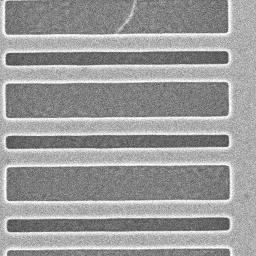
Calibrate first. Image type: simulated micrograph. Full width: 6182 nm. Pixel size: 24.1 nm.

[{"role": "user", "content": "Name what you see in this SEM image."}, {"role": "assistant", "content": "groups of lines, slits or small figures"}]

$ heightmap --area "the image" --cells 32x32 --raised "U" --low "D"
UDDDDDDDDDDDDDDDDDDDDDDDDDDDDUUU
UDDDDDDDDDDDDDDDDDDDDDDDDDDDDUUU
UDDDDDDDDDDDDDDDDDDDDDDDDDDDDUUU
UDDDDDDDDDDDDDDDDDDDDDDDDDDDDUUU
UUUUUUUUUUUUUUUUUUUUUUUUUUUUUUUU
UUUUUUUUUUUUUUUUUUUUUUUUUUUUUUUU
UUUUUDDDDDDDDDDDDDDDDDDDDDDDUUUU
UDDDDDDDDDDDDDDDDDDDDDDDDDDDDUUU
UUUUUUUUUUUUUUUUUUUUUUUUUUUUUUUU
UUUUUUUUUUUUUUUUUUUUUUUUUUUUUUUU
UDDDDDDDDDDDDDDDDDDDDDDDDDDDUUUU
UDDDDDDDDDDDDDDDDDDDDDDDDDDDDUUU
UDDDDDDDDDDDDDDDDDDDDDDDDDDDDUUU
UDDDDDDDDDDDDDDDDDDDDDDDDDDDDUUU
UDDDDDDDDDDDDDDDDDDDDDDDDDDDUUUU
UUUUUUUUUUUUUUUUUUUUUUUUUUUUUUUU
UUUUUUUUUUUUUUUUUUUUUUUUUUUUUUUU
UDDDDDDDDDDDDDDDDDDDDDDDDDDDDUUU
UDDDDDDDDDDDDDDDDDDDDDDUUUUUUUUU
UUUUUUUUUUUUUUUUUUUUUUUUUUUUUUUU
UUUUUUUUUUUUUUUUUUUUUUUUUUUUUUUU
UDDDDDDDDDDDDDDDDDDDDDDDDDDDDUUU
UDDDDDDDDDDDDDDDDDDDDDDDDDDDDUUU
UDDDDDDDDDDDDDDDDDDDDDDDDDDDDUUU
UDDDDDDDDDDDDDDDDDDDDDDDDDDDDUUU
UUUUUUUUUUUUUUUUUUUUUUUUUUUUUUUU
UUUUUUUUUUUUUUUUUUUUUUUUUUUUUUUU
UDDDDDDDDDDDDDDDDDDDDDDDDDDDDUUU
UDDDDDDDDDDDDDDDDDDDDDDDDDDDDUUU
UUUUUUUUUUUUUUUUUUUUUUUUUUUUUUUU
UUUUUUUUUUUUUUUUUUUUUUUUUUUUUUUU
UDDDDDDDDDDDDDDDDDDDDDDDDDDDDUUU